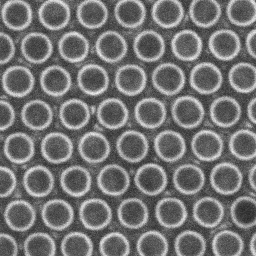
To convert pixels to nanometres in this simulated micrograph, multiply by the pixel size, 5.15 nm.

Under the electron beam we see a regular array of raised bodies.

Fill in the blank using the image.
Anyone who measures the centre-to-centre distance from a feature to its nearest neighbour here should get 0.193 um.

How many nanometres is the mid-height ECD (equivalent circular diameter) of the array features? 148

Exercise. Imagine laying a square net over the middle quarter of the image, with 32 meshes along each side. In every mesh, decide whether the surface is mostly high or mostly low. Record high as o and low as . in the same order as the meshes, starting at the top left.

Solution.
......oo........o.......oooo....
.....ooooo....ooooo....oooooo...
o...oooooo...ooooooo...oooooo...
o...ooooooo..ooooooo..oooooooo..
o...ooooooo..ooooooo..oooooooo..
o...ooooooo..ooooooo...oooooo...
o....ooooo....ooooo.....ooooo...
................oo..............
................................
.ooo......oooo.....ooooo....oooo
ooooo....oooooo...ooooooo..ooooo
oooooo...oooooo...ooooooo..ooooo
oooooo...ooooooo..ooooooo..ooooo
oooooo...oooooo...ooooooo...oooo
ooooo....oooooo....ooooo....oooo
.oooo......ooo......ooo.......oo
................................
......oo.......oooo.....oooo....
o....ooooo....oooooo...oooooo...
oo..ooooooo...oooooo...ooooooo..
oo..ooooooo...ooooooo..ooooooo..
oo..ooooooo...ooooooo..ooooooo..
oo..ooooooo...oooooo....oooooo..
o....ooooo.....oooo......ooo....
................................
...........oo........oo........o
.oooo.....ooooo....ooooo....oooo
oooooo...ooooooo..ooooooo...oooo
oooooo...ooooooo..ooooooo...oooo
oooooo...ooooooo..ooooooo...oooo
oooooo...ooooooo...oooooo...oooo
oooooo....ooooo.....oooo.....ooo